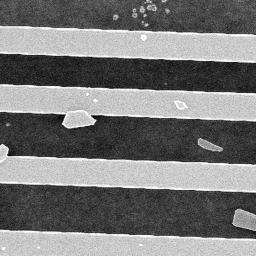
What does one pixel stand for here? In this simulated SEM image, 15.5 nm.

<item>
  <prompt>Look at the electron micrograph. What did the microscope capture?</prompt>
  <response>lines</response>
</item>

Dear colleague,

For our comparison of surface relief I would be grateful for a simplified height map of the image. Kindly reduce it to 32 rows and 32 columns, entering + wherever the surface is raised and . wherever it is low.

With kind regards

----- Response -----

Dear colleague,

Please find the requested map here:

................................
................................
................................
+++++++.........................
++++++++++++++++++++++++++++++++
++++++++++++++++++++++++++++++++
++++++++++++++++++++++++++++++++
........................++++++++
................................
................................
................................
++++++++++++++++++++++++++......
++++++++++++++++++++++++++++++++
++++++++++++++++++++++++++++++++
........++++....++++++++++++++++
........++++....................
................................
................................
+...............................
+...............................
+++++++++++++++++++++++++++++...
++++++++++++++++++++++++++++++++
++++++++++++++++++++++++++++++++
..................++++++++++++++
................................
................................
................................
................................
................................
+++++++++++++++++++.............
++++++++++++++++++++++++++++++++
++++++++++++++++++++++++++++++++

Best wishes